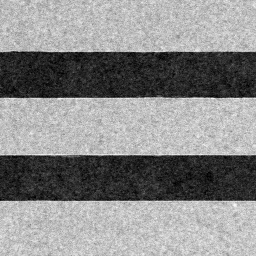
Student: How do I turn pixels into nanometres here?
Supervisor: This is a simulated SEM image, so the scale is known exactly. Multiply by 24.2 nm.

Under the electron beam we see one or a few lines or trenches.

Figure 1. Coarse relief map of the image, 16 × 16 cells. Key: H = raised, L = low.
HHHHHHHHHHHHHHHH
HHHHHHHHHHHHHHHH
HHHHHHHHHHHHHHHH
LLLLLLLLLLLLLLLL
LLLLLLLLLLLLLLLL
LLLLLLLLLLLLLLLL
HHHHHHHHHHHHHHHH
HHHHHHHHHHHHHHHH
HHHHHHHHHHHHHHHH
HHHHHHHHHHHHHHHH
LLLLLLLLLLLLLLLL
LLLLLLLLLLLLLLLL
LLLLLLLLLLLLLLLL
HHHHHHHHHHHHHHHH
HHHHHHHHHHHHHHHH
HHHHHHHHHHHHHHHH